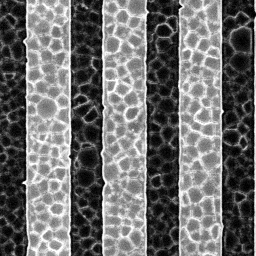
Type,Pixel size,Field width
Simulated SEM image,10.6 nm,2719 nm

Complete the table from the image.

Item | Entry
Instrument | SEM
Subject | one or a few lines or trenches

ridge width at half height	449	nm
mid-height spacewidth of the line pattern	356	nm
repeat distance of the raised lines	811	nm